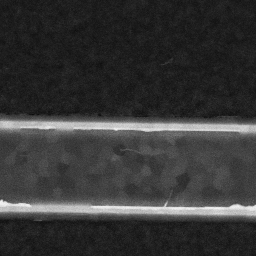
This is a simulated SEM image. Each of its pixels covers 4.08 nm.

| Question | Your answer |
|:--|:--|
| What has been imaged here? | one or a few lines or trenches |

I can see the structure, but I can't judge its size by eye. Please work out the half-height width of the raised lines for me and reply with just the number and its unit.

0.344 um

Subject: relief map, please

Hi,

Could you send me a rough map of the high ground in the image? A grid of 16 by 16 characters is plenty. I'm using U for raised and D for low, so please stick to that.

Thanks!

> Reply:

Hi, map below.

DDDDDDDDDDDDDDDD
DDDDDDDDDDDDDDDD
DDDDDDDDDDDDDDDD
DDDDDDDDDDDDDDDD
DDDDDDDDDDDDDDDD
DDDDDDDDDDDDDDDD
DDDDDDDDDDDDDDDD
DDDDDDDDDDDDDDDD
UUUUUUUUUUUUUUUU
UUUUUUUUUUUUUUUU
UUUUUUUUUUUUUUUU
UUUUUUUUUUUUUUUU
UUUUUUUUUUUUUUUU
DDDDDDDDDDDDDDDD
DDDDDDDDDDDDDDDD
DDDDDDDDDDDDDDDD